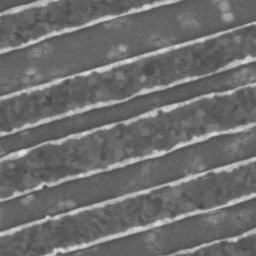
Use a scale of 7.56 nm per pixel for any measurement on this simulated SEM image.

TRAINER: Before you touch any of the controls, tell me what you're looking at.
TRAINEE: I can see one or a few lines or trenches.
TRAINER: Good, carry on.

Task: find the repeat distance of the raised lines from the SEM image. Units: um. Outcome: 0.495